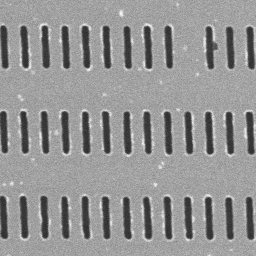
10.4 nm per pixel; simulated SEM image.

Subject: a regular array of holes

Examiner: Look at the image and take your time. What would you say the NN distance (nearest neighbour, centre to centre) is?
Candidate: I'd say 212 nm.